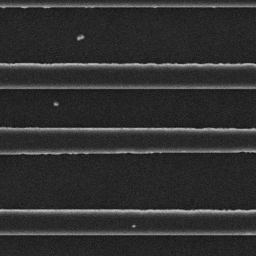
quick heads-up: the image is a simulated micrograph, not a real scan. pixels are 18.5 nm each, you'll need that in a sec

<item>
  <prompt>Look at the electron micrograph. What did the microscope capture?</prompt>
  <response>lines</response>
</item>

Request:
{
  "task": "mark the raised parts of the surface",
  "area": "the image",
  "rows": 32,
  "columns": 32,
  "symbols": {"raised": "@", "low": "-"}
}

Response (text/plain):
@@@@@@@@@@@@@@@@@@@@@@@@@@@@@@@@
--------------------------------
--------------------------------
--------------------------------
--------------------------------
--------------------------------
--------------------------------
--------------------------------
@@@@@@@@@@@@@@@@@@@@@@@@@@@@@@@@
@@@@@@@@@@@@@@@@@@@@@@@@@@@@@@@@
@@@@@@@@@@@@@@@@@@@@@@@@@@@@@@@@
--------------------------------
--------------------------------
--------------------------------
--------------------------------
--------------------------------
@@@@@@@@@@@@@@@@@@@@@@@@@@@@@@@@
@@@@@@@@@@@@@@@@@@@@@@@@@@@@@@@@
@@@@@@@@@@@@@@@@@@@@@@@@@@@@@@@@
--------------------------------
--------------------------------
--------------------------------
--------------------------------
--------------------------------
--------------------------------
--------------------------------
@@@@@@@@@@@@@@@@@@@@@@@@@@@@@@@@
@@@@@@@@@@@@@@@@@@@@@@@@@@@@@@@@
@@@@@@@@@@@@@@@@@@@@@@@@@@@@@@@@
--------------------------------
--------------------------------
--------------------------------